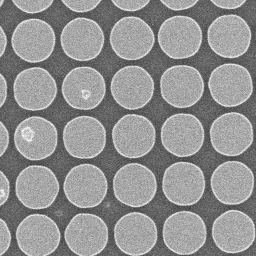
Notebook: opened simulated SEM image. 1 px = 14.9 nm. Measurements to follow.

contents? an array of small figures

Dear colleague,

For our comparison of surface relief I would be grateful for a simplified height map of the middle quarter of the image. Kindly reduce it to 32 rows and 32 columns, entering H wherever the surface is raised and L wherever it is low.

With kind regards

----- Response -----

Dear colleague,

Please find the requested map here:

LLLLLLLLLLLLLLLLLLLLLLLLLLLLHHHL
LLHHHHHHLLLLLLHHHHHHLLLLLLHHHHHH
LHHHHHHHHLLLLHHHHHHHHLLLLHHHHHHH
HHHHHHHHHHLLHHHHHHHHHHLLHHHHHHHH
HHHHHHHHHHLLHHHHHHHHHHLLHHHHHHHH
HHHHHHHHHHLLHHHHHHHHHHLLHHHHHHHH
HHHHHHHHHHLLHHHHHHHHHHLLHHHHHHHH
HHHHHHHHHHLLHHHHHHHHHHLLHHHHHHHH
HHHHHHHHHHLLLHHHHHHHHHLLLHHHHHHH
LHHHHHHHHLLLLHHHHHHHHLLLLLHHHHHH
LLHHHHHHLLLLLLLHHHHHLLLLLLLHHHHL
LLLLLLLLLLLLLLLLLLLLLLLLLLLLLLLL
LLLLLLLLLLLLLLLLLLLLLLLLLLLLHHLL
LLLHHHHLLLLLLLLHHHHHLLLLLLHHHHHH
LHHHHHHHHLLLLHHHHHHHHLLLLHHHHHHH
HHHHHHHHHHLLLHHHHHHHHHLLLHHHHHHH
HHHHHHHHHHLLHHHHHHHHHHHLHHHHHHHH
HHHHHHHHHHLLHHHHHHHHHHHLHHHHHHHH
HHHHHHHHHHLLHHHHHHHHHHHLHHHHHHHH
HHHHHHHHHHLLHHHHHHHHHHHLLHHHHHHH
HHHHHHHHHHLLLHHHHHHHHHLLLHHHHHHH
LHHHHHHHHHLLLHHHHHHHHLLLLLHHHHHH
LLHHHHHHHLLLLLHHHHHHLLLLLLLHHHHH
LLLLLLLLLLLLLLLLLLLLLLLLLLLLLLLL
LLLLLLLLLLLLLLLLLLLLLLLLLLLLLLLL
LLLLHHHLLLLLLLLHHHHHLLLLLLLHHHHH
LLHHHHHHHLLLLLHHHHHHHLLLLLHHHHHH
LHHHHHHHHHLLLHHHHHHHHHLLLHHHHHHH
HHHHHHHHHHLLLHHHHHHHHHHLLHHHHHHH
HHHHHHHHHHHLHHHHHHHHHHHLLHHHHHHH
HHHHHHHHHHHLHHHHHHHHHHHLLHHHHHHH
HHHHHHHHHHHLHHHHHHHHHHHLLHHHHHHH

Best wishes